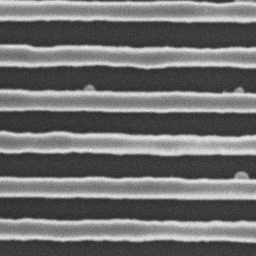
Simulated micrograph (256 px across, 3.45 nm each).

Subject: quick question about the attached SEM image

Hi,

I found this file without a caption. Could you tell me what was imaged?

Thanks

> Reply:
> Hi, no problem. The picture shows lines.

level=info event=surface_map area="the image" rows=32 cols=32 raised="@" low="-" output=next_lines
@@@@@@@@@@@@@@@@@@@@@@@@@@@@@@@@
@@@@@@@@@@@@@@@@@@@@@@@@@@@@@@@@
--------------@@@@@@@@@@@@@@@@@@
--------------------------------
--------------------------------
--------------------------------
@@@@@@@@@@@@@@@@@@@@@@@@@@@@@@@@
@@@@@@@@@@@@@@@@@@@@@@@@@@@@@@@@
--------------------------------
--------------------------------
--------------------------------
@@@@-@@-@@@@--------------------
@@@@@@@@@@@@@@@@@@@@@@@@@@@@@@@@
@@@@@@@@@@@@@@@@@@@@@@@@@@@@@@@@
--------------------------------
--------------------------------
@-------------------------------
@@@@@@@@@@@@@@@@@@@@@@@@@@@@@@@@
@@@@@@@@@@@@@@@@@@@@@@@@@@@@@@@@
--------------------------------
--------------------------------
--------------------------------
@@@@@@@@@@@@@@@@@@@@@@@@@@@-@@@@
@@@@@@@@@@@@@@@@@@@@@@@@@@@@@@@@
-@@@-@@@@@@@@@@@@@@@@@@@@@@@@@@@
--------------------------------
--------------------------------
@@@@----------------------------
@@@@@@@@@@@@@@@@@@@@@@@@@@@@@@@@
@@@@@@@@@@@@@@@@@@@@@@@@@@@@@@@@
--------------------------------
--------------------------------